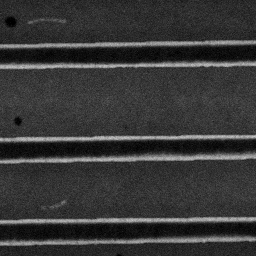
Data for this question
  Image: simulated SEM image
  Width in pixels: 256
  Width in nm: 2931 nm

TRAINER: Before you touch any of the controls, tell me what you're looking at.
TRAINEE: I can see lines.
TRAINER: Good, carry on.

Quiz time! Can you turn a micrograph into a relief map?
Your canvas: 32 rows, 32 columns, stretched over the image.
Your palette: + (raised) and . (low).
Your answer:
................................
................................
................................
................................
................................
...............+++++++++++++++++
++++++++++++++++++++++++++++++++
++++++++++++++++++++++++++++++++
.++.............................
................................
................................
................................
................................
................................
................................
................................
................................
++++++++++++++++++++++++++++++++
++++++++++++++++++++++++++++++++
++++++++++++++++++++++++++++++++
................................
................................
................................
................................
................................
................................
................................
......++++++++++++++++++++++++++
++++++++++++++++++++++++++++++++
++++++++++++++++++++++++++++++++
++++............................
................................